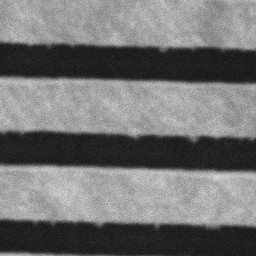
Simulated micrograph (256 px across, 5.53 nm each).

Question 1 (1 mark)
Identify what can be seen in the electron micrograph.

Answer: lines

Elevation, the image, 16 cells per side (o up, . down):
oooooooooooooooo
oooooooooooooooo
oooooooooooooooo
................
................
oooooooooooooooo
oooooooooooooooo
oooooooooooooooo
..............oo
................
oooooo..........
oooooooooooooooo
oooooooooooooooo
oooooooooooooooo
................
................